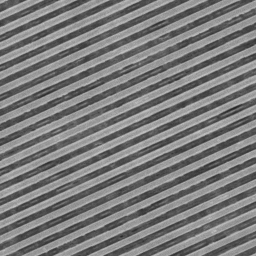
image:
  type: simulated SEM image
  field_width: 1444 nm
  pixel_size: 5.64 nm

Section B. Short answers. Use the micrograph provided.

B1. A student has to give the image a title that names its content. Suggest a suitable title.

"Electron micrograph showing parallel lines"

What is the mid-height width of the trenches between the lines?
43.6 nanometres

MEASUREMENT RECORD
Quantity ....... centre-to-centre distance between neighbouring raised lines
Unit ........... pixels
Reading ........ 13.5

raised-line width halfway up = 32.7 nm